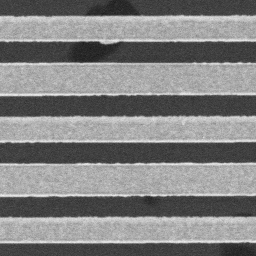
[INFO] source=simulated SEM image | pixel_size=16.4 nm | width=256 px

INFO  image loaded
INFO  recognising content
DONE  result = lines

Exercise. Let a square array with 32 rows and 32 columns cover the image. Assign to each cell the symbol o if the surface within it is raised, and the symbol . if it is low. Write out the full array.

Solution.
................................
................................
ooooooo.....oooooooooooooooooooo
oooooooooooooooooooooooooooooooo
oooooooooooooooooooooooooooooooo
................................
................................
................................
oooooooooooooooooooooooooooooooo
oooooooooooooooooooooooooooooooo
oooooooooooooooooooooooooooooooo
oooooooooooooooooooooooooooooooo
................................
................................
................................
oooooooooooooooooooooooooooooooo
oooooooooooooooooooooooooooooooo
oooooooooooooooooooooooooooooooo
................................
................................
..............o..oooo.ooo.oooooo
oooooooooooooooooooooooooooooooo
oooooooooooooooooooooooooooooooo
oooooooooooooooooooooooooooooooo
................................
................................
................................
.o...ooooooooooooooooo..o.ooooo.
oooooooooooooooooooooooooooooooo
oooooooooooooooooooooooooooooooo
................................
................................